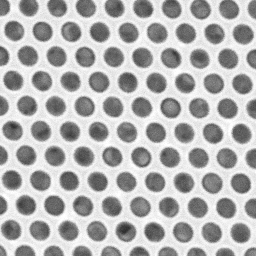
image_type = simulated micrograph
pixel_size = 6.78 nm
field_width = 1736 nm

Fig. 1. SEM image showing a regular array of holes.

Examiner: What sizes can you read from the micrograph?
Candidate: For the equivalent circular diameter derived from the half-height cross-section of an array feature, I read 0.147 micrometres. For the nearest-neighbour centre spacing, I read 193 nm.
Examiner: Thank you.